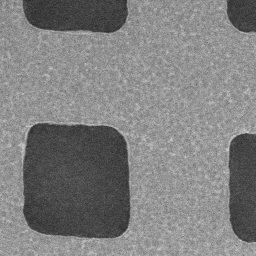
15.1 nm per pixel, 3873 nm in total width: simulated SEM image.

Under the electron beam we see holes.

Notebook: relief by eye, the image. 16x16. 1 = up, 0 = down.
1000000011111100
1100000011111110
1111111111111111
1111111111111111
1111111111111111
1111111111111111
1111111111111111
1111111111111111
1100000011111110
1100000011111100
1000000011111100
1000000011111100
1000000011111100
1100000011111100
1100000011111110
1111111111111111